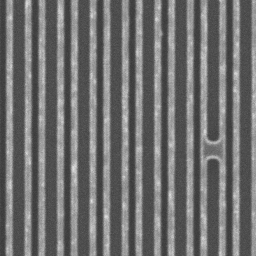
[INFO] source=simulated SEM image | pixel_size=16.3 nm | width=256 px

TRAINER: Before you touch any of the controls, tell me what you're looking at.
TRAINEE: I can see parallel lines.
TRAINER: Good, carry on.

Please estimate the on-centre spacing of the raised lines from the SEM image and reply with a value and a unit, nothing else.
265 nm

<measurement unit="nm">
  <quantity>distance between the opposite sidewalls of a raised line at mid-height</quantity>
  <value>91.9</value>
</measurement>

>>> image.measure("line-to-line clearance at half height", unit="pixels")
12.9